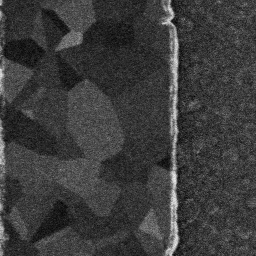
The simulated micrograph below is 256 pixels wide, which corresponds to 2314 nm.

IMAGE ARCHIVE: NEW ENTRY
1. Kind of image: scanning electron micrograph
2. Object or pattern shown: one or a few lines or trenches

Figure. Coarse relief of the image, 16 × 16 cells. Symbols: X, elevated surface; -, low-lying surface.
XXXXXXXXXXX-----
XXXXXXXXXXX-----
XXXXXXXXXXX-----
XXXXXXXXXXX-----
XXXXXXXXXXX-----
XXXXXXXXXXX-----
XXXXXXXXXXX-----
XXXXXXXXXXX-----
XXXXXXXXXXX-----
XXXXXXXXXXX-----
XXXXXXXXXXX-----
XXXXXXXXXXX-----
XXXXXXXXXXX-----
XXXXXXXXXXX-----
XXXXXXXXXXX-----
XXXXXXXXXXX-----